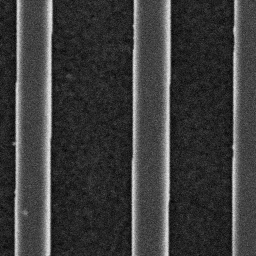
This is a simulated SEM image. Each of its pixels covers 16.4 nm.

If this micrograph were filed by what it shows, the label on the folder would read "lines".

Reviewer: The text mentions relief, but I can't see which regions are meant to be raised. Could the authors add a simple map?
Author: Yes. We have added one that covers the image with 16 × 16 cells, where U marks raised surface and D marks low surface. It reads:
DUUDDDDDUUUDDDDU
DUUDDDDDUUUDDDDU
DUUDDDDDUUUDDDDU
DUUDDDDDUUUDDDDU
DUUDDDDDUUUDDDDU
DUUDDDDDUUUDDDDU
DUUDDDDDUUUDDDDU
DUUDDDDDUUUDDDDU
DUUDDDDDUUUDDDDU
DUUDDDDDUUUDDDDU
DUUDDDDDUUUDDDDU
DUUDDDDDUUUDDDDU
DUUDDDDDUUDDDDDU
DUUDDDDDUUDDDDDU
DUUDDDDDUUDDDDDU
DUUDDDDDUUDDDDDU